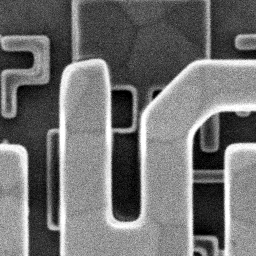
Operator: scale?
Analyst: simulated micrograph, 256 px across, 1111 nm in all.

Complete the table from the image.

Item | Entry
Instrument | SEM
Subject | wiring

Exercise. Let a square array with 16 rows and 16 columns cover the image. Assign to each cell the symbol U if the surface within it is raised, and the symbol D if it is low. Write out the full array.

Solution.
DDDDDDDDDDDDDDDD
DDDDDDDDDDDDDDDD
DDDDDDDDDDDDDDDD
DDDDDDDDDDDDDDDD
DDDDUUUDDDDUUUUU
DDDDUUUDDDUUUUUU
DDDDUUUDDUUUUUUU
DDDDUUUDDUUUUDDD
DDDDUUUDDUUUDDDD
UUDDUUUDDUUUDDUU
UUDDUUUDDUUUDDUU
UUDDUUUDDUUUDDUU
UUDDUUUDDUUUDDUU
UUDDUUUDDUUUDDUU
UUDDUUUUUUUUDDUU
UUDDUUUUUUUUDDUU